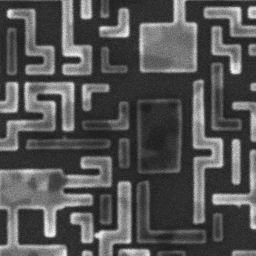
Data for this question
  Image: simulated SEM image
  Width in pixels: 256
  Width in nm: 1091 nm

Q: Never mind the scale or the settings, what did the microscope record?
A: wiring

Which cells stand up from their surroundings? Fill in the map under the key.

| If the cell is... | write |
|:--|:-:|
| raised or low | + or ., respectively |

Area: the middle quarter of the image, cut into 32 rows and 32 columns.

+++++++...++.......+++++++++++++
+++++++...++++++...+++++++++++++
++++++..........................
................................
................................
++...++++++.....................
++...++++++.....................
++...++.........................
++...++.........................
++...++...........+++++++++++...
++...++.......++..+++++++++++...
++............++..+++++++++++...
++............++..+++++++++++...
++............++..+++++++++++...
++...+++++++++++..+++++++++++...
++...+++++++++++..+++++++++++...
++.................++++++++++...
...................++++++++++...
...................++++++++++...
+++++++++++...++...++++++++++...
+++++++++++...++...++++++++++...
..............++...++++++++++...
..............++...++++++++++...
.....++++++...++...++++++++++...
....++++++++..++...++++++++++...
....++++++++..++...++++++++++...
.........+++.......++++++++++...
.........+++....................
++++++++++++....................
++++++++++++.......++...........
+++++++++++...+++.+++...........
..............+++.+++...........